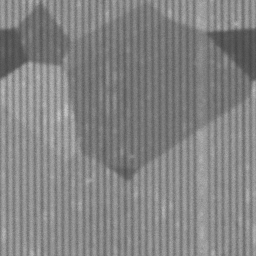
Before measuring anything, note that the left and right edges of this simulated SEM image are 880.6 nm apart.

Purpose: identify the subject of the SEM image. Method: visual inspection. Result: parallel lines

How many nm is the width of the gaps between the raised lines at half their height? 6.4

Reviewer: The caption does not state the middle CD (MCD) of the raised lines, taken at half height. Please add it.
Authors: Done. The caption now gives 16.3 nm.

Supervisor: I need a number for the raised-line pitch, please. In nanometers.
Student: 24